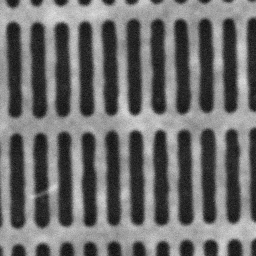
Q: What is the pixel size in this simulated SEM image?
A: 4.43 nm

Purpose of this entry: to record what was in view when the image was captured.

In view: groups of lines, slits or small figures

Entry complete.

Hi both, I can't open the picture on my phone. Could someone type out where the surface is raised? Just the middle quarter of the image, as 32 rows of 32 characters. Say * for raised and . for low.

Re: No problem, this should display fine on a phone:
..**....*....***...***...***...*
..**....**....**...***...***...*
..**....**....**...***...***....
..**....**....**....**....**...*
..**....**....**....**...***...*
..**....**....**....**...***...*
..**....**....**....**...***....
..**....**....**....**...***....
..**....**....**....**....**....
..**....**....**....**....**....
..**....**....**....**....**....
..**....**....**...***....**...*
.***...***...***...****..****..*
********************************
********************************
********************************
*****************.*****..****..*
..***..***...***....***...**....
..**....**....**....**....**....
..**....**....**....**....**....
..**....**....**....**....**....
..**....**....**....**....**....
..**....**....**....**....**....
..**....**....**....**....**....
..***...**....**....**....**....
..***...**....**....**....***...
..***...**....**....**....***...
..***...**....**....**....***...
..**....**....**....**....***...
..**....**....**....**....***...
..**....**....**....**.....*....
..**....**....**....**.....*....